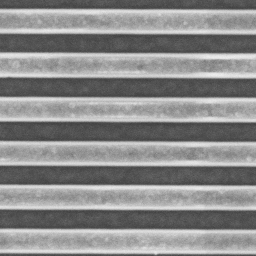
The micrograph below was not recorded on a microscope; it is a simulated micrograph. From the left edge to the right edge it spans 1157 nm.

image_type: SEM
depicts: parallel lines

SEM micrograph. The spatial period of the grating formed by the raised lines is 0.199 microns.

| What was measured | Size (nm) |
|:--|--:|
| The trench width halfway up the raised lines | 96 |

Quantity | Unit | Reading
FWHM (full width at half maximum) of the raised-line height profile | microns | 0.101